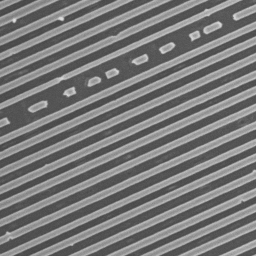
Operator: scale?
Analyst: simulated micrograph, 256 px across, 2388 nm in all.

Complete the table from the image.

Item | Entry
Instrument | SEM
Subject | parallel lines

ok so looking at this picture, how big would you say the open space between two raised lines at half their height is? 0.0786 microns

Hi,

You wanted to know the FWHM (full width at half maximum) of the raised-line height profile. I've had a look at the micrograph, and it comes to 7.51 pixels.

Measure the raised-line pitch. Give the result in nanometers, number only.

142